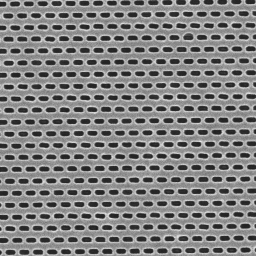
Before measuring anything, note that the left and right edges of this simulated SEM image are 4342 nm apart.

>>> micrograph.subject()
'a regular array of holes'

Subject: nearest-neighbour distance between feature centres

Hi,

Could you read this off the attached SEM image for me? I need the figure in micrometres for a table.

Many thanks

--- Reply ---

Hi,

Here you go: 0.228